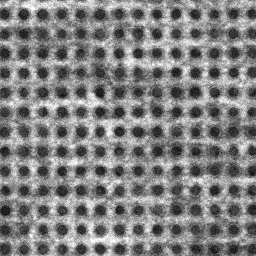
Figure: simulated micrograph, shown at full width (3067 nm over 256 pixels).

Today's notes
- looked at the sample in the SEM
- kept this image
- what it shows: a regular array of raised bodies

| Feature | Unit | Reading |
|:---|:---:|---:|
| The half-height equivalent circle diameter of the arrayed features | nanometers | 142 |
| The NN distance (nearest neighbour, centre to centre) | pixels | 18.9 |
